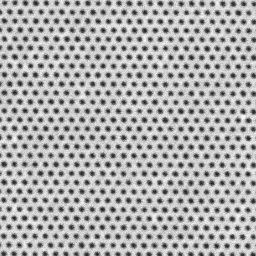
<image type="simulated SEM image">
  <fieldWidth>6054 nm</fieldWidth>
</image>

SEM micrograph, a regular array of holes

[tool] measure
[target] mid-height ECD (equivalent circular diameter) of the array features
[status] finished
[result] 149 nm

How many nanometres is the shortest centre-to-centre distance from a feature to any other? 238